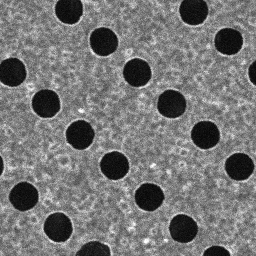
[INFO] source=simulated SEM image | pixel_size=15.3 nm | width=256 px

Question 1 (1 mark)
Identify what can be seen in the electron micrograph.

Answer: a regular array of holes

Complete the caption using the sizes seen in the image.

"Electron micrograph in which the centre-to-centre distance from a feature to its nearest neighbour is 704 nm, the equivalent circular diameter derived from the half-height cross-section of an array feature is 453 nanometers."